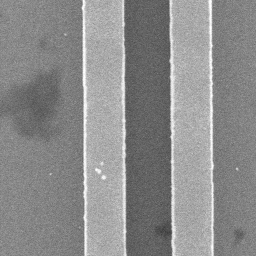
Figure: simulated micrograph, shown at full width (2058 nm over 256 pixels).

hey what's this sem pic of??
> lines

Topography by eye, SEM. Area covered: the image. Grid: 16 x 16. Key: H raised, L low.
LLLLLHHHLLLHHLLL
LLLLLHHHLLLHHLLL
LLLLLHHHLLLHHLLL
LLLLLHHHLLLHHLLL
LLLLLHHHLLLHHLLL
LLLLLHHHLLLHHLLL
LLLLLHHHLLLHHLLL
LLLLLHHHLLLHHLLL
LLLLLHHHLLLHHLLL
LLLLLHHHLLLHHLLL
LLLLLHHHLLLHHLLL
LLLLLHHHLLLHHLLL
LLLLLHHHLLLHHLLL
LLLLLHHHLLLHHLLL
LLLLLHHHLLLHHLLL
LLLLLHHHLLLHHLLL